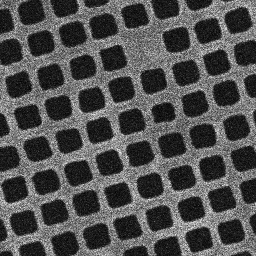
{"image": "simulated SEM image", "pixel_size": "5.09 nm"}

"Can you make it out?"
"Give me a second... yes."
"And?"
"a regular array of holes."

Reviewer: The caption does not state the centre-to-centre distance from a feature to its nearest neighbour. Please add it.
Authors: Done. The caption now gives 164 nm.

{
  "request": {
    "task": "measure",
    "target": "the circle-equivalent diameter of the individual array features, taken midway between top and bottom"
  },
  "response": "137 nm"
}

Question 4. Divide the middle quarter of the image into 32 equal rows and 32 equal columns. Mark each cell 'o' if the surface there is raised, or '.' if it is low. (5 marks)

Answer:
o.......oo.....oooooooooooo.....
oo......oo...oooooooo....oo.....
oo......ooooooooooo......oo.....
oo....ooooooo....oo......ooo....
ooooooooooo......oo.......oo....
ooooooooooo......ooo......ooo.oo
ooooo....oo.......oo.....ooooooo
oooo......oo......ooo.ooooooooo.
.oo.......oo.....oooooooooooo...
..oo......ooo..oooooooooooooo...
..oo......oooooooooooo.....ooo..
..oo.....ooooooo...ooo......oo..
..oooooooooooo......oo......oo..
.oooooooo..ooo......oo......oooo
oooooo......oo......ooo.oooooooo
ooooo.......oo......oooooooooooo
....o.......oo......ooooooooooo.
....oo......ooo..ooooooooo...oo.
....oo......oooooooooooo......oo
.....o....ooooooooo..oo.......oo
.....ooooooooooo......oo......oo
....oooooooo.ooo......oo.......o
.ooooooo......oo......oo......oo
oooooooo......oo.......oo.oooooo
oo....oo......oo......oooooooooo
......oo.......oo..oooooooooo..o
.......oo......ooooooooooo......
.......oo....oooooooo...oo......
o......ooooooooooo......oo......
o.....oooooooo.ooo.......o......
oo..ooooooo.....oo.......oo.....
oooooo.ooo.......o.......oo...oo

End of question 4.